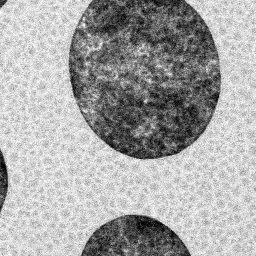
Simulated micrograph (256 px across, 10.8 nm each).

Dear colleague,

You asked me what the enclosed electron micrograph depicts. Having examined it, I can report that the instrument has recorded holes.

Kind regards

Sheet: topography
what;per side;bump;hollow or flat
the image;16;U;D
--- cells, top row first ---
UUUUUDDDDDDDUUUU
UUUUUDDDDDDDDUUU
UUUUDDDDDDDDDUUU
UUUUDDDDDDDDDDUU
UUUUDDDDDDDDDDUU
UUUUUDDDDDDDDDUU
UUUUUDDDDDDDDDUU
UUUUUDDDDDDDDUUU
UUUUUUDDDDDDDUUU
UUUUUUUDDDDUUUUU
UUUUUUUUUUUUUUUU
DUUUUUUUUUUUUUUU
UUUUUUUUUUUUUUUU
UUUUUUUUDUUUUUUU
UUUUUUDDDDDUUUUU
UUUUUDDDDDDDUUUU